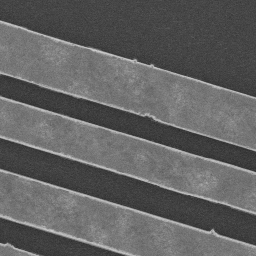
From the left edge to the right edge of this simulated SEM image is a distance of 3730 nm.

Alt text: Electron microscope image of one or a few lines or trenches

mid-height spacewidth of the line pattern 394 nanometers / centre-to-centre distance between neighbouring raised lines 994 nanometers